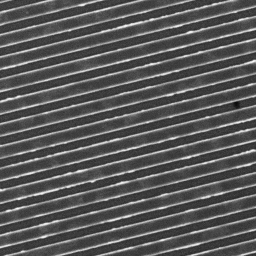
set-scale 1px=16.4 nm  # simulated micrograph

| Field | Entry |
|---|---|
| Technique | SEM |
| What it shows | parallel lines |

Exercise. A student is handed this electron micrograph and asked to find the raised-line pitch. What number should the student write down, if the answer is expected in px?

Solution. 21.6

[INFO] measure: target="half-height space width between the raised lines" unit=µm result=0.142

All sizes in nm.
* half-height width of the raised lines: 212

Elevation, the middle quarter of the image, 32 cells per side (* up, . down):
**********..........************
******..........*************...
**..........**************......
........**************.........*
....*************.........******
*************.........**********
*********.........**************
*****.........**************....
*.........*************.........
......*************..........***
..*************..........*******
***********.........************
*******.........**************..
***.........**************......
........**************.........*
....*************..........*****
*************..........*********
*********..........*************
*****..........*************....
*.........**************........
......**************.........***
..**************.........*******
***********..........***********
********.........**************.
****.........**************.....
.........*************..........
.....*************.........*****
****.**********.........********
**********.........*************
*******.......******.********...
**.........**************.......
.......*************..........**